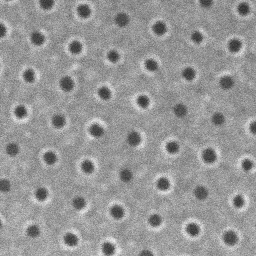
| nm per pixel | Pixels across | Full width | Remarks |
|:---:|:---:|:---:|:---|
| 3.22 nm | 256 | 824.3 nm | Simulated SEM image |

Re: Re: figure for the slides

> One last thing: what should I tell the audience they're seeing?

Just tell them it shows a regular array of holes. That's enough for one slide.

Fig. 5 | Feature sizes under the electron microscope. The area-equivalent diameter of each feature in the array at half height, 14.8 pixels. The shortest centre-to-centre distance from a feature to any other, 37.5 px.